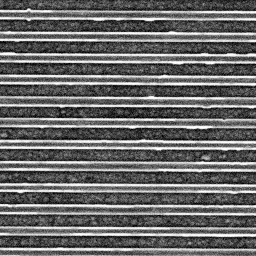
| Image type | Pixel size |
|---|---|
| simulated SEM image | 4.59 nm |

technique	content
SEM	parallel lines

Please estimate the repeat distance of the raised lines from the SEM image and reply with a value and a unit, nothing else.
99.4 nanometers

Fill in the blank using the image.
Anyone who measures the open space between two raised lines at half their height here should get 0.058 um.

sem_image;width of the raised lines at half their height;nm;41.3